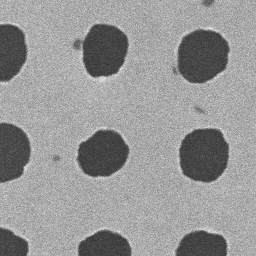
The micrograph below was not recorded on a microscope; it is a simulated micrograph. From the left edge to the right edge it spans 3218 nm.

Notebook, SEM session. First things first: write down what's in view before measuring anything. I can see holes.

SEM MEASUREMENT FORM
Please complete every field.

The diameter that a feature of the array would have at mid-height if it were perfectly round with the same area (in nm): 654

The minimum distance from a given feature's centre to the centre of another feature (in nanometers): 1240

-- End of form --